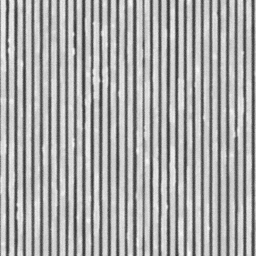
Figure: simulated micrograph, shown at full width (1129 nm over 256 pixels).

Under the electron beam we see parallel lines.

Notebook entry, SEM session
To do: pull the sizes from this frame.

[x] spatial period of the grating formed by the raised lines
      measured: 37.4 nm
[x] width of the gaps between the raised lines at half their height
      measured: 16.5 nm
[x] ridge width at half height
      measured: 0.0209 microns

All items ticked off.